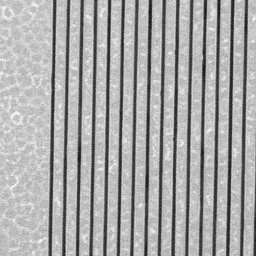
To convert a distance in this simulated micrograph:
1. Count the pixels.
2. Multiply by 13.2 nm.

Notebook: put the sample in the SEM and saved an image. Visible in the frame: parallel lines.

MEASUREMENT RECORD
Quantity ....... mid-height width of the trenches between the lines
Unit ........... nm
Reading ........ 47.8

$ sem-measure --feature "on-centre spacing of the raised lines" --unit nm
180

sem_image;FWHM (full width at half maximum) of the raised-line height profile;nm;130